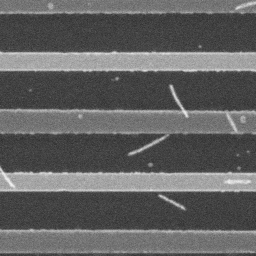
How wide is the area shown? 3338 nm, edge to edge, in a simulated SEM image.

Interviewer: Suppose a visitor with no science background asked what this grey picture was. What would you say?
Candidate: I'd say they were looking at lines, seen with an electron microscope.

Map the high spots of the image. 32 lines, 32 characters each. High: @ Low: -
@@@@@@@@@@@@@@@@@@@@@@@@@@@@@@@@
@@@@@@@@@@@@@@@@@@@@@@@@@@@@@@@@
--------------------------------
--------------------------------
--------------------------------
--------------------------------
--------------------------------
@@@@@@@@@@@@@@@@@@@@@@@@@@@@@@@@
@@@@@@@@@@@@@@@@@@@@@@@@@@@@@@@@
--------------------------------
--------------------------------
--------------------------------
--------------------------------
--------------------------------
@@@@@@@@@@@@@@@@@@@@@@@@@@@@@@@@
@@@@@@@@@@@@@@@@@@@@@@@@@@@@@@@@
@@@@@@@@@@@@@@@@@@@@@@@@@@@@@@@@
--------------------------------
--------------------------------
--------------------------------
--------------------------------
--------------------------------
@@@@@@@@@@@@@@@@@@@@@@@@@@@@@@@@
@@@@@@@@@@@@@@@@@@@@@@@@@@@@@@@@
--------------------------------
--------------------------------
--------------------------------
--------------------------------
--------------------------------
@@@@@@@@@@@@@@@@@@@@@@@@@@@@@@@@
@@@@@@@@@@@@@@@@@@@@@@@@@@@@@@@@
@@@@@@@@@@@@@@@@@@@@@@@@@@@@@@@@